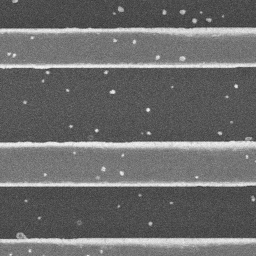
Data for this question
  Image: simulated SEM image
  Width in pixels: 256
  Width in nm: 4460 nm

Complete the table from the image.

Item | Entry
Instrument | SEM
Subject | lines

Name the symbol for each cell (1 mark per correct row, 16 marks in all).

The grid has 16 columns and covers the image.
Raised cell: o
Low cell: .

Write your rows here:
................
................
oooooooooooooooo
oooooooooooooooo
................
................
................
................
................
oooooooooooooooo
oooooooooooooooo
oooooooooooooooo
................
................
................
oooooooooooooooo